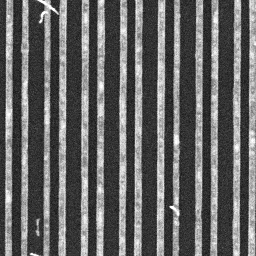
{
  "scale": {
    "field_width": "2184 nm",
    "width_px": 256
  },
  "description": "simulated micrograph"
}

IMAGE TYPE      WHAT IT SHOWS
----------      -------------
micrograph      parallel lines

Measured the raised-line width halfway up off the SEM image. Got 53.3 nm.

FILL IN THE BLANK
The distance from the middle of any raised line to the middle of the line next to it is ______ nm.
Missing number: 161